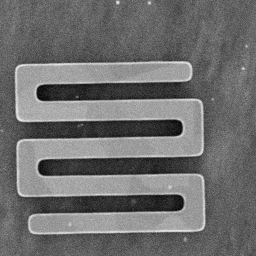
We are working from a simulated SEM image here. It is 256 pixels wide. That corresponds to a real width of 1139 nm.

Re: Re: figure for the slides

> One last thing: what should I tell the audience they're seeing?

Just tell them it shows groups of lines, slits or small figures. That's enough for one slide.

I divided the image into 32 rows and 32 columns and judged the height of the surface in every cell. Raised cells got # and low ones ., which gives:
................................
................................
................................
................................
................................
................................
................................
................................
..######################........
..######################........
..####..........................
..###...........................
..###..............######.......
..#######################.......
..#######################.......
.......................##.......
.......................##.......
...######################.......
..#######################.......
..#####################.........
..###...........................
..###...........................
..#######################.......
..#######################.......
.......................###......
.......................###......
......................####......
....######################......
....#####################.......
................................
................................
................................